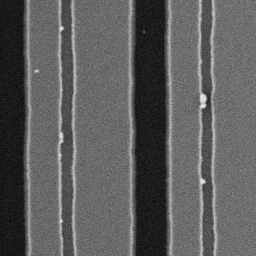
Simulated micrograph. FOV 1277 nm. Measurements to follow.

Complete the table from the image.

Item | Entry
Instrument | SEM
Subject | lines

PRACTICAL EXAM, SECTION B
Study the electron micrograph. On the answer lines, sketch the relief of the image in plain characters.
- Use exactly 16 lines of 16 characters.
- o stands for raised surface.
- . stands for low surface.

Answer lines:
..oooooo..oooooo
..oooooo..oooooo
..oooooo..oooooo
..oooooo..oooooo
..oooooo..oooooo
..oooooo...ooooo
..oooooo...ooooo
..oooooo...ooooo
..oooooo...ooooo
..oooooo...ooooo
..oooooo...ooooo
..oooooo...ooooo
..oooooo...ooooo
..oooooo...ooooo
..oooooo...ooooo
..oooooo...ooooo